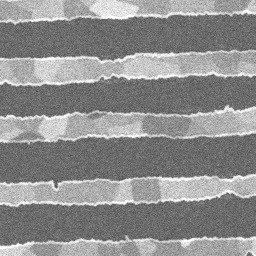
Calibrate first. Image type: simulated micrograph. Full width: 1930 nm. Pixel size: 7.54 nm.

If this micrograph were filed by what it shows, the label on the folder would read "one or a few lines or trenches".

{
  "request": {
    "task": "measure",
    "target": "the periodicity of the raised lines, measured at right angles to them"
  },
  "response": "0.464 um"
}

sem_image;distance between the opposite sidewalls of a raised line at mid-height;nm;172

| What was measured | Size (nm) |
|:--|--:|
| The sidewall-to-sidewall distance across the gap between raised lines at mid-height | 293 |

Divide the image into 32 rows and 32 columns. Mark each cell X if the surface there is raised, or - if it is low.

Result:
XXXXXXXXXXXXXXXXXXXXXXXXXXXXXXXX
XXXXXXXXXXXXXXXXXXXXXXXXXXXXXXXX
XXXXX-X-------------------------
--------------------------------
--------------------------------
--------------------------------
---------------------------X-XXX
XXXXXXXXXXXX---XXXXXXXXXXXXXXXXX
XXXXXXXXXXXXXXXXXXXXXXXXXXXXXXXX
XXXXXXXXXXXXXX-XXXXXXXX---------
-XXXX--X------------------------
--------------------------------
--------------------------------
----------------------------X---
--------XXXXXXXXXXXXXXXXXXXXXXXX
XXXXXXXXXXXXXXXXXXXXXXXXXXXXXXXX
XXXXXXXXXXXXXXXXXXXXXXXXXXXXXXXX
XXXXXXX-------------------------
--------------------------------
--------------------------------
--------------------------------
--------------------------------
------------X---XXXXXXXXXXXXXXXX
XXXXXXXXXXXXXXXXXXXXXXXXXXXXXXXX
XXXXXXXXXXXXXXXXXXXXXXXXXXX---X-
XXX----XXXXX--------------------
--------------------------------
--------------------------------
--------------------------------
--------------------------------
---XXXXXXXXXXXXXXXXXXXXXXXXXXXXX
XXXXXXXXXXXXXXXXXXXXXXXXXXXXXXXX